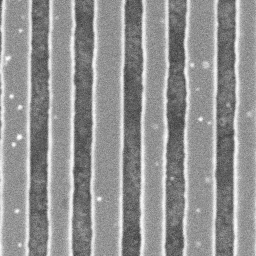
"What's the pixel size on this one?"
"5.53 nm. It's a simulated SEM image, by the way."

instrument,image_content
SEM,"lines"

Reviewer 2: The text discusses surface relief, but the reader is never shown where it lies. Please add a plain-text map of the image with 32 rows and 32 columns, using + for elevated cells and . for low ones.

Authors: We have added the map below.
++++..+++...++++..+++..++++...++
++++..+++...+++...+++..++++...++
++++..+++...+++...+++..++++...++
++++..+++...+++...+++..++++...++
++++..+++...+++...+++..++++...++
++++..+++...+++...+++..++++..+++
++++..+++...+++...+++..++++..+++
++++..+++...+++...+++..++++...++
++++..+++...+++...+++..++++..+++
++++..+++...+++...+++..++++...++
++++..+++...+++...+++..++++...++
++++..+++...+++...+++..++++...++
++++..+++...+++...+++..++++...++
++++..+++...+++...+++..++++..+++
++++..+++...+++...+++..++++..+++
++++..+++...+++...+++..++++..+++
++++..+++...+++...+++..++++..+++
++++..+++...+++...+++..++++..+++
++++..+++...+++...+++..++++..+++
++++..+++...+++...+++..++++..+++
++++..+++...+++...+++..++++..+++
++++..+++...+++...+++..++++..+++
++++..+++..++++...+++..++++..+++
++++..+++..++++...+++..++++..+++
++++..+++..++++...+++..++++..+++
++++..+++...+++...+++..++++..+++
++++..+++...+++...+++..++++..+++
++++..+++...+++...+++..++++..+++
++++..+++...+++...+++..++++..+++
++++..+++...+++...+++..++++..+++
++++..+++...+++...+++..++++..+++
++++..+++..++++...+++..++++..+++